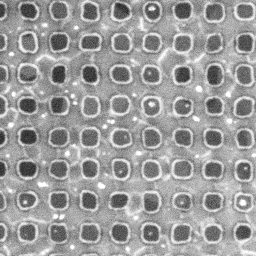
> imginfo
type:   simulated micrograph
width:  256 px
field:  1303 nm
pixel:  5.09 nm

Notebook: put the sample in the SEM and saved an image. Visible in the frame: a regular array of raised bodies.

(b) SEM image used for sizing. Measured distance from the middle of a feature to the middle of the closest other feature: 155 nanometers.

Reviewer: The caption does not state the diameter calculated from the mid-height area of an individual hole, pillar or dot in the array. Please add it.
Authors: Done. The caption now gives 100 nm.